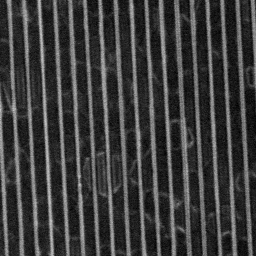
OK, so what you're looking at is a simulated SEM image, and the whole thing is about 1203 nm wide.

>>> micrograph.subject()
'parallel lines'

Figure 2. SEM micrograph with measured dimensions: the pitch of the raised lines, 0.0716 microns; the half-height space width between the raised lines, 0.0575 µm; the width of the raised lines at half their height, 13.5 nanometers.